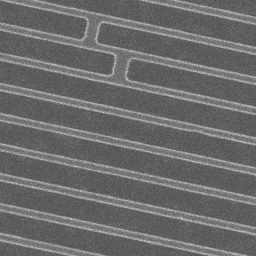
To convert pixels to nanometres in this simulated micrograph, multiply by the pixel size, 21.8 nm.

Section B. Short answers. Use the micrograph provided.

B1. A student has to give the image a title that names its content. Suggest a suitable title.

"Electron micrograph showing parallel lines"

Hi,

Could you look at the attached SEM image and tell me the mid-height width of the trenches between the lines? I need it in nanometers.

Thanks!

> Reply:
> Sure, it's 496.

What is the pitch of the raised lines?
642 nanometres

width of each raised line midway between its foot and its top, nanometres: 144